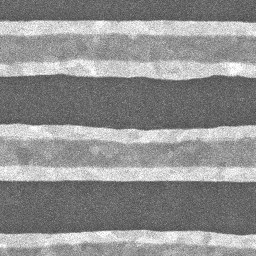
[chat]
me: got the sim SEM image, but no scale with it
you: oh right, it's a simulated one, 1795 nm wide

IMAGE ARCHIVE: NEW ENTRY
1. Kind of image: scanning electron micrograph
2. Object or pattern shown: one or a few lines or trenches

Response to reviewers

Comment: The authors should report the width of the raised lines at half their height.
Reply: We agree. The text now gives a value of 294 nm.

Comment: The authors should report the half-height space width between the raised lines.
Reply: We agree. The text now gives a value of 0.442 microns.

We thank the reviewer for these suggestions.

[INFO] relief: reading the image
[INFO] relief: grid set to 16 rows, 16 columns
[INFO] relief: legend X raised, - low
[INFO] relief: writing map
----------------
----------------
XXXXXXXXXXXXXXXX
XXXXXXXXXXXXXXXX
----------------
----------------
----------------
----------------
XXXXXXXXX--XXXXX
XXXXXXXXXXXXXXXX
XXXXXXXXXXXXXXXX
----------------
----------------
----------------
----------------
XXXXXXXXXXXXXXXX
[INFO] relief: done